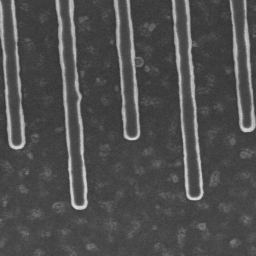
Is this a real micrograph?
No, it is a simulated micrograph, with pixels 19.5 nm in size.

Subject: parallel lines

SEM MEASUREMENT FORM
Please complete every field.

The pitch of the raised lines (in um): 1.13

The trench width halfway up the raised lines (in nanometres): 866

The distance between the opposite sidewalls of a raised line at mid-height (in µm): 0.27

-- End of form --